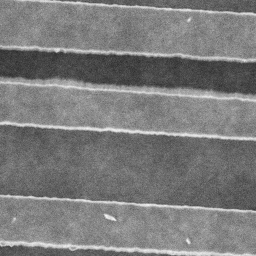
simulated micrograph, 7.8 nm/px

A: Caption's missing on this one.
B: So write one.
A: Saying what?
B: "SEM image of lines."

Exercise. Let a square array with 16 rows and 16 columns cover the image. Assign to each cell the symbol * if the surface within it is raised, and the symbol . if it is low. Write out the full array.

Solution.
**********......
****************
****************
...........*****
................
******..........
****************
****************
.............***
................
................
................
*****...........
****************
****************
....*.**********